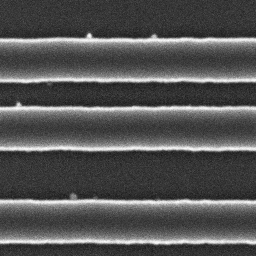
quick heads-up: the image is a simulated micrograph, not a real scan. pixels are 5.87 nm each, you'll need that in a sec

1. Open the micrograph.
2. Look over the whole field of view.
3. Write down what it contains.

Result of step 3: lines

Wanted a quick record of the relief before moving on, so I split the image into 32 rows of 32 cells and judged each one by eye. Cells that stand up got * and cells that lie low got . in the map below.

................................
................................
................................
................................
................................
********************************
********************************
********************************
********************************
********************************
................................
................................
................................
.**********.*...****************
********************************
********************************
********************************
********************************
********************************
................................
................................
................................
................................
................................
................................
********************************
********************************
********************************
********************************
********************************
................................
................................